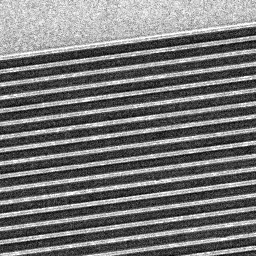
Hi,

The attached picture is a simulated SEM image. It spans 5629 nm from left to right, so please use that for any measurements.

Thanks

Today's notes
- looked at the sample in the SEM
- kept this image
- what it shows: parallel lines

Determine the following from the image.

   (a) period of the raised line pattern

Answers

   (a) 286 nm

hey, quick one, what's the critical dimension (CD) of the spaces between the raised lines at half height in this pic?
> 199 nm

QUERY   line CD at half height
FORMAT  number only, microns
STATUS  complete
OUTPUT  0.079